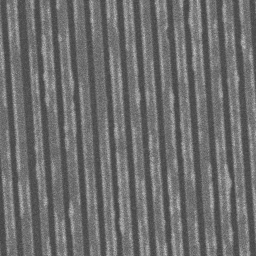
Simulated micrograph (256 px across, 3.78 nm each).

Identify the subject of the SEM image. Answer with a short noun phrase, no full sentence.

parallel lines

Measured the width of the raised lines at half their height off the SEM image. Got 35.8 nm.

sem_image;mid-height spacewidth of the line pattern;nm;25.9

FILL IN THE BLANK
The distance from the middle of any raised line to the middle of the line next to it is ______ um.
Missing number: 0.0626